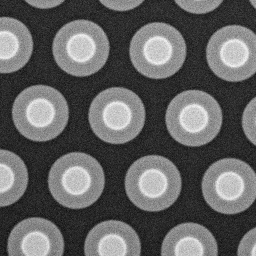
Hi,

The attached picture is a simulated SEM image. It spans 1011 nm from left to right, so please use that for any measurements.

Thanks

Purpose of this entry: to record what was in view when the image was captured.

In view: an array of small figures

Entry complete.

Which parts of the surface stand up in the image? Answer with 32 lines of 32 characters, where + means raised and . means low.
....+++......++++.....+++++....+
........................++......
++..............................
+++.....+++++.....++++......+++.
++++...++++++....++++++....+++++
++++...+++++++..+++++++...++++++
++++...+++++++..+++++++...++++++
++++...++++++...+++++++...++++++
+++.....+++++....+++++....++++++
..................+++......++++.
................................
...++++......++++......++.......
..++++++....++++++....+++++.....
..+++++++..+++++++...+++++++...+
..+++++++..+++++++...+++++++..++
..++++++...+++++++...+++++++..++
..++++++....+++++....++++++....+
....++.......+++......++++.....+
................................
++......+++.......++............
+++....+++++.....+++++.....++++.
+++...+++++++...++++++....++++++
+++...+++++++...+++++++..+++++++
+++...+++++++...+++++++..+++++++
+++....+++++....++++++...+++++++
+.......+++......+++++....+++++.
...........................+++..
...+++..........................
..+++++.....++++......++++......
.+++++++...++++++....++++++....+
.+++++++...+++++++..+++++++...++
.+++++++...+++++++..+++++++...++